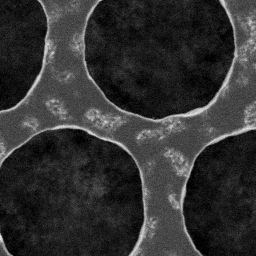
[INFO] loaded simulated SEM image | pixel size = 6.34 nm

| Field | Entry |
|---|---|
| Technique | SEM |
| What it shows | holes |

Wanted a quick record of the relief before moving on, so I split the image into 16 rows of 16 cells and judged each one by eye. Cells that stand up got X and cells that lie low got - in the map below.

---XXX--------XX
---XX---------XX
---XX----------X
---XX----------X
---XXX--------XX
--XXXX--------XX
-XXXXXX------XXX
XXXXXXXXXXXXXXXX
XX----XXXXXXXX--
X-------XXXXX---
---------XXX----
---------XXX----
---------XX-----
---------XX-----
---------XXX----
--------XXXX----